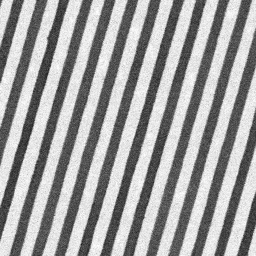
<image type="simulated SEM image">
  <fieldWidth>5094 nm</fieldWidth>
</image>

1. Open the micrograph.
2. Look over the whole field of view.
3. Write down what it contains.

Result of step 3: parallel lines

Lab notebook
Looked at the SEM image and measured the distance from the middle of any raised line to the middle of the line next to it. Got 436 nm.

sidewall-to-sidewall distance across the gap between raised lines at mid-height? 215 nanometers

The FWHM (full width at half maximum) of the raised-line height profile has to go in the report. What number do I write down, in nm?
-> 218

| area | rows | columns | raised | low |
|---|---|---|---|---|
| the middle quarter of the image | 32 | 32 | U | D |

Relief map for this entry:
DDDUUDDDUUUDDDUUUDDDUUUDDUUUDDDU
DDUUUDDDUUUDDDUUUDDUUUDDDUUUDDDU
DDUUUDDDUUDDDUUUDDDUUUDDDUUUDDUU
DDUUUDDUUUDDDUUUDDDUUUDDUUUDDDUU
DUUUDDDUUUDDDUUUDDUUUDDDUUUDDDUU
DUUUDDDUUUDDUUUDDDUUUDDDUUUDDDUU
DUUUDDDUUDDDUUUDDDUUUDDUUUUDDUUU
DUUDDDUUUDDDUUUDDDUUUDDUUUDDDUUU
UUUDDDUUUDDDUUDDDUUUDDDUUUDDDUUU
UUUDDDUUDDDUUUDDDUUUDDDUUUDDDUUD
UUUDDUUUDDDUUUDDDUUUDDUUUDDDUUUD
UUDDDUUUDDDUUUDDUUUDDDUUUDDDUUUD
UUDDDUUUDDUUUDDDUUUDDDUUUDDDUUDD
UUDDDUUDDDUUUDDDUUUDDUUUUDDUUUDD
UDDDUUUDDDUUUDDDUUUDDUUUDDDUUUDD
UDDDUUUDDDUUDDDUUUDDDUUUDDDUUUDD
UDDDUUDDDUUUDDDUUUDDDUUUDDDUUDDD
UDDUUUDDDUUUDDDUUUDDDUUDDDUUUDDD
DDDUUUDDDUUUDDUUUDDDUUUDDDUUUDDD
DDDUUUDDUUUDDDUUUDDDUUUDDUUUDDDU
DDDUUDDDUUUDDDUUUDDDUUUDDUUUDDDU
DDUUUDDDUUUDDDUUUDDUUUDDDUUUDDDU
DDUUUDDDUUDDDUUUDDDUUUDDDUUUDDUU
DDUUDDDUUUDDDUUUDDDUUUDDUUUDDDUU
DUUUDDDUUUDDDUUUDDUUUDDDUUUDDDUU
DUUUDDDUUUDDUUUDDDUUUDDDUUUDDDUU
DUUUDDUUUDDDUUUDDDUUUDDUUUDDDUUU
DUUDDDUUUDDDUUUDDUUUUDDUUUDDDUUU
UUUDDDUUUDDDUUUDDUUUDDDUUUDDDUUU
UUUDDDUUDDDUUUDDDUUUDDDUUUDDUUUD
UUDDDUUUDDDUUUDDDUUUDDUUUDDDUUUD
UUDDDUUUDDDUUUDDUUUDDDUUUDDDUUUD